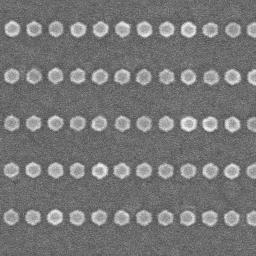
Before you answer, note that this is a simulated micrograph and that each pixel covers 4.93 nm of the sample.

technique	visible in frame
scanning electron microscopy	a regular array of raised bodies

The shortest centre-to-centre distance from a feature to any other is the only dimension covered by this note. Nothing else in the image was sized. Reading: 108 nm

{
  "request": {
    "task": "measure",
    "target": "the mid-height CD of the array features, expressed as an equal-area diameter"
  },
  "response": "0.0691 um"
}